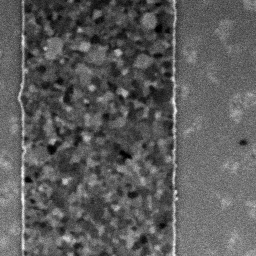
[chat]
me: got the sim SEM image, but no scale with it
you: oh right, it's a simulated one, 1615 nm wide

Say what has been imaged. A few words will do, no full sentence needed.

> one or a few lines or trenches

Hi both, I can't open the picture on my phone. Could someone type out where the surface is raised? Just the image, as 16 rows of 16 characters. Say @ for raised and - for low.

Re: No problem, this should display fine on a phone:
-@@@@@@@@@@-----
-@@@@@@@@@@-----
-@@@@@@@@@@-----
-@@@@@@@@@@-----
-@@@@@@@@@@-----
-@@@@@@@@@@-----
-@@@@@@@@@@-----
-@@@@@@@@@@-----
-@@@@@@@@@@-----
-@@@@@@@@@@-----
-@@@@@@@@@@-----
-@@@@@@@@@@-----
-@@@@@@@@@@-----
-@@@@@@@@@@-----
-@@@@@@@@@@-----
-@@@@@@@@@@-----